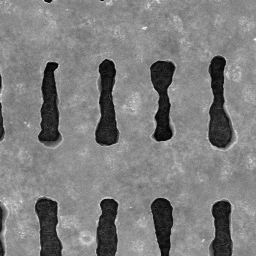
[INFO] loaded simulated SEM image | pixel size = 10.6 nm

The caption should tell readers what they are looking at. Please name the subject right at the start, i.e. holes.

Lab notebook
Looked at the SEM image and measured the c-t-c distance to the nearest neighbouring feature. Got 602 nanometers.